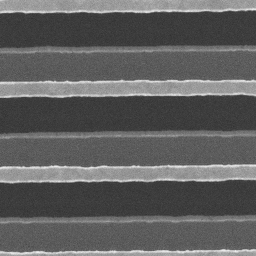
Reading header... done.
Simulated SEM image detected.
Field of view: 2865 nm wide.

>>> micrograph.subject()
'lines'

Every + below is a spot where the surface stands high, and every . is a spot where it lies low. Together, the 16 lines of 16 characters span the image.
++++++++++++++++
................
................
++++++++++++++++
++++++++++++++++
++++++++++++++++
................
................
......++++++++++
++++++++++++++++
++++++++++++++++
................
................
................
++++++++++++++++
++++++++++++++++